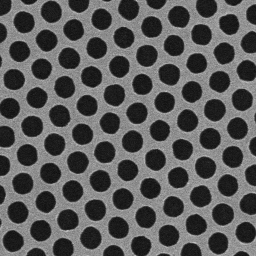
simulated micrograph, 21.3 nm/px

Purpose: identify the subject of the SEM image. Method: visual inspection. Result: a regular array of holes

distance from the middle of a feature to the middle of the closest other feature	612	nm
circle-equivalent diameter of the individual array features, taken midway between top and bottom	461	nanometres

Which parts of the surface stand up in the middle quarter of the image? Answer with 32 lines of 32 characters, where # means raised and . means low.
....#######.....####..##....###.
#####....##.....########.....##.
####.....###....###.####.....###
..##.....########.....##.....###
..##.....########.....##....###.
...###..###...###.....########..
...#######.....##.....#######...
..########.....###...###...##...
.###....##.....########.....##..
###.....##.....#######......###.
###.....####.###....###.....####
.##.....########.....##....###..
.###....##...##......########...
..#######.....##.....#######....
.########.....###...###..###....
.##...###.....########....##....
##.....##.....###.###......##...
##.....####.###....###....######
##.....########.....##....######
###....##..###......#######....#
########....###.....#######.....
########.....##....###..###.....
##...##......#######.....##.....
#.....##.....#######.....###...#
#.....###...##...###.....#######
#.....#######.....###....#######
#....########......###..###...##
#######....##.....########.....#
######......##....###.####.....#
#...##......#######....###.....#
.....##.....#######.....###...##
.....##....##...###.....########